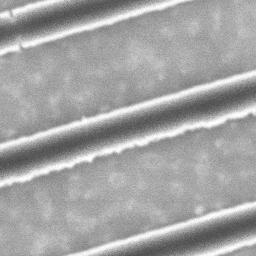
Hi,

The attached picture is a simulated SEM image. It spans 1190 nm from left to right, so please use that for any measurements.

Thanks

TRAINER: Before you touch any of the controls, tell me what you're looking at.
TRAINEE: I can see one or a few lines or trenches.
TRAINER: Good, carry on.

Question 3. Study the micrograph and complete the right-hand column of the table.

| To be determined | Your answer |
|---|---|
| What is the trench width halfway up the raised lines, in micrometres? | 0.412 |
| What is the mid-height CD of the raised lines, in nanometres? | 172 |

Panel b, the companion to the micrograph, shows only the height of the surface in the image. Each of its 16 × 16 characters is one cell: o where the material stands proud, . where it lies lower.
.ooooooooo......
oooooo..........
ooo.............
................
................
............oooo
.........ooooooo
.....ooooooooo..
..oooooooo......
ooooooo.........
oooo............
................
................
.............ooo
..........oooooo
......ooooooooo.